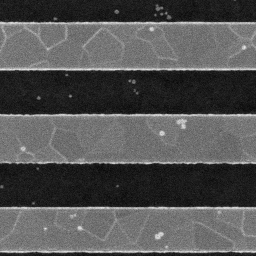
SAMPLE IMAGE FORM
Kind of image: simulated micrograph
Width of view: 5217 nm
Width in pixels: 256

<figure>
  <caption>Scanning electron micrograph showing lines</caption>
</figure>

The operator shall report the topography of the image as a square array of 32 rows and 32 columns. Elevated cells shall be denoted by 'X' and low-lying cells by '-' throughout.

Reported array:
--------------------------------
--------------------------------
--------------------------------
XXXXXXXXXXXXXXXXXXXXXXXXXXXXXXXX
XXXXXXXXXXXXXXXXXXXXXXXXXXXXXXXX
XXXXXXXXXXXXXXXXXXXXXXXXXXXXXXXX
XXXXXXXXXXXXXXXXXXXXXXXXXXXXXXXX
XXXXXXXXXXXXXXXXXXXXXXXXXXXXXXXX
XXXXXXXXXXXXXXXXXXXXXXXXXXXXXXXX
--------------------------------
--------------------------------
--------------------------------
--------------------------------
--------------------------------
XXXXXXXXXXXXXXXXXXXXXXXXXXXXXXXX
XXXXXXXXXXXXXXXXXXXXXXXXXXXXXXXX
XXXXXXXXXXXXXXXXXXXXXXXXXXXXXXXX
XXXXXXXXXXXXXXXXXXXXXXXXXXXXXXXX
XXXXXXXXXXXXXXXXXXXXXXXXXXXXXXXX
XXXXXXXXXXXXXXXXXXXXXXXXXXXXXXXX
--------------------------------
--------------------------------
--------------------------------
--------------------------------
--------------------------------
--------------------------------
XXXXXXXXXXXXXXXXXXXXXXXXXXXXXXXX
XXXXXXXXXXXXXXXXXXXXXXXXXXXXXXXX
XXXXXXXXXXXXXXXXXXXXXXXXXXXXXXXX
XXXXXXXXXXXXXXXXXXXXXXXXXXXXXXXX
XXXXXXXXXXXXXXXXXXXXXXXXXXXXXXXX
--------------------------------